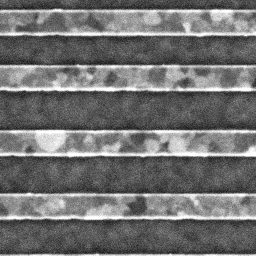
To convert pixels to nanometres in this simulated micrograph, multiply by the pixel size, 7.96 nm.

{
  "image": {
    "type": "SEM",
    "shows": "lines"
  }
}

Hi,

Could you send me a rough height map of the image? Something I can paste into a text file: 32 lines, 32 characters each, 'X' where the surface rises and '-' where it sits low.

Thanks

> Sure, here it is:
--------------------------------
XXXXXXXXXXXXXXXXXXXXXXXXXXXXXXXX
XXXXXXXXXXXXXXXXXXXXXXXXXXXXXXXX
XXXXXXXXXXXXXXXXXXXXXXXXXXXXXXXX
--------------------------------
--------------------------------
--------------------------------
--------------------------------
XXXXXXXXXXXXXXXXXXXXXXXXXXXXXXXX
XXXXXXXXXXXXXXXXXXXXXXXXXXXXXXXX
XXXXXXXXXXXXXXXXXXXXXXXXXXXXXXXX
--------------------------------
--------------------------------
--------------------------------
--------------------------------
--------------------------------
XXXXXXXXXXXXXXXXXXXXXXXXXXXXXXXX
XXXXXXXXXXXXXXXXXXXXXXXXXXXXXXXX
XXXXXXXXXXXXXXXXXXXXXXXXXXXXXXXX
--------------------------------
--------------------------------
--------------------------------
--------------------------------
--------------------------------
XXXXXXXXXXXXXXXXXXXXXXXXXXXXXXXX
XXXXXXXXXXXXXXXXXXXXXXXXXXXXXXXX
XXXXXXXXXXXXXXXXXXXXXXXXXXXXXXXX
--------------------------------
--------------------------------
--------------------------------
--------------------------------
--------------------------------